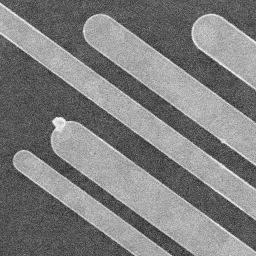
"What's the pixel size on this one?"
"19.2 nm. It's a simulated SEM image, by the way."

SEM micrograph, groups of lines, slits or small figures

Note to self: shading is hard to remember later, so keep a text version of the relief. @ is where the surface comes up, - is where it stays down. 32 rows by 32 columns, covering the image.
--------------------------------
@-------------------------------
@@@--------@@@-----------@@@----
@@@@-------@@@@@--------@@@@@@--
@@@@@@-----@@@@@@-------@@@@@@@-
--@@@@@----@@@@@@@------@@@@@@@@
---@@@@@-----@@@@@@@------@@@@@@
-----@@@@@----@@@@@@@------@@@@@
------@@@@@----@@@@@@@------@@@@
-------@@@@@@----@@@@@@@------@@
---------@@@@@----@@@@@@@------@
----------@@@@@----@@@@@@@@-----
-----------@@@@@@----@@@@@@@----
-------------@@@@@----@@@@@@@---
--------------@@@@@-----@@@@@@@-
-------@@@------@@@@@----@@@@@@@
-------@@@@------@@@@@----@@@@@@
------@@@@@@@-----@@@@@@----@@@@
-------@@@@@@@------@@@@@----@@@
--@@---@@@@@@@@------@@@@@----@@
--@@@@---@@@@@@@@-----@@@@@@----
---@@@@---@@@@@@@@------@@@@@---
----@@@@---@@@@@@@@@-----@@@@@--
-----@@@@@---@@@@@@@@------@@@@@
-------@@@@---@@@@@@@@------@@@@
--------@@@@@---@@@@@@@@-----@@@
----------@@@@---@@@@@@@@------@
-----------@@@@---@@@@@@@@------
------------@@@@@---@@@@@@@@----
--------------@@@@---@@@@@@@@---
---------------@@@@---@@@@@@@@@-
----------------@@@@@---@@@@@@@@